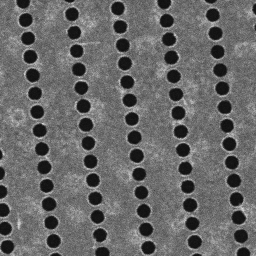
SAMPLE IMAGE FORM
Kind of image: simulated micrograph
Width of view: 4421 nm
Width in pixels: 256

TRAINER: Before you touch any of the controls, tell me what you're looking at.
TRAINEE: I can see a regular array of holes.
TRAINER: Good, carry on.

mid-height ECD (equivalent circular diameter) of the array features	247	nanometers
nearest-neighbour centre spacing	318	nm